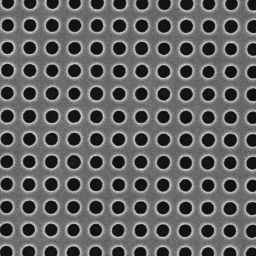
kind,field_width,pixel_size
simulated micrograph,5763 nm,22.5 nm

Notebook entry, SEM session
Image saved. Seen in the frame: a regular array of holes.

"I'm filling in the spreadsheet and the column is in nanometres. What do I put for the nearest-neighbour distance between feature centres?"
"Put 501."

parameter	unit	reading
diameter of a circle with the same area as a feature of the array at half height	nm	295